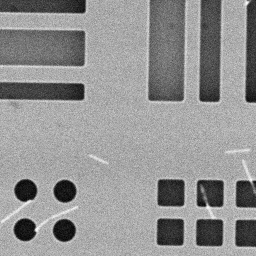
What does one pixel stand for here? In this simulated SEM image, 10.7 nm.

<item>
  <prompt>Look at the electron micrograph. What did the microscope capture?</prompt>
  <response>groups of lines, slits or small figures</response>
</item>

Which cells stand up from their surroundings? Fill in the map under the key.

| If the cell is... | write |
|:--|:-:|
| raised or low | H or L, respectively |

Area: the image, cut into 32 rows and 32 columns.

LLLLLLLLLLLHHHHHHHHLLLLHHLLLHHHL
LLLLLLLLLLLHHHHHHHHLLLLHHLLLHHHL
HHHHHHHHHHHHHHHHHHHLLLLHHLLLHHHL
HHHHHHHHHHHHHHHHHHLLLLLHHLLLHHHL
LLLLLLLLLLLHHHHHHHLLLLLHHLLLHHHL
LLLLLLLLLLLHHHHHHHLLLLLHHLLLHHHL
LLLLLLLLLLLHHHHHHHLLLLLHHLLLHHHL
LLLLLLLLLLLHHHHHHHLLLLLHHLLLHHHL
HHHHHHHHHHHHHHHHHHLLLLLHHLLLHHHL
HHHHHHHHHHHHHHHHHHLLLLLHHLLLHHHL
LLLLLLLLLLHHHHHHHHLLLLLHHLLLHHHL
LLLLLLLLLLLHHHHHHHLLLLLHHLLLHHHL
HLLLLLLLLLHHHHHHHHHLLLLHHLLHHHHL
HHHHHHHHHHHHHHHHHHHHHHHHHHHHHHHH
HHHHHHHHHHHHHHHHHHHHHHHHHHHHHHHH
HHHHHHHHHHHHHHHHHHHHHHHHHHHHHHHH
HHHHHHHHHHHHHHHHHHHHHHHHHHHHHHHH
HHHHHHHHHHHHHHHHHHHHHHHHHHHHHHHH
HHHHHHHHHHHHHHHHHHHHHHHHHHHHHHHH
HHHHHHHHHHHHHHHHHHHHHHHHHHHHHHHH
HHHHHHHHHHHHHHHHHHHHHHHHHHHHHHHH
HHHHHHHHHHHHHHHHHHHHHHHHHHHHHHHH
HHHLHHHHLHHHHHHHHHHHLLLHHLLHHHLH
HHLLLHHLLLHHHHHHHHHHLLLHHLLLHLLL
HHLLHHHLLHHHHHHHHHHHLLLHHLLLHLLL
HHHHHHHHHHHHHHHHHHHHLLLHHLLLHHLL
HHHHHHHHHHHHHHHHHHHHHHHHHHHHHHHH
HHLLHHHHLHHHHHHHHHHHLLLHHLLLHHLL
HHLLLHHLLHHHHHHHHHHHLLLHLLLLHLLL
HHLLHHHLLHHHHHHHHHHHLLLHLLLLHLLL
HHHHHHHHHHHHHHHHHHHHLLLHHLLLHLLL
HHHHHHHHHHHHHHHHHHHHHHHHHHHHHHHH